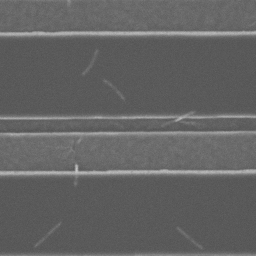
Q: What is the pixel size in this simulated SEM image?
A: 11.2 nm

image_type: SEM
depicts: lines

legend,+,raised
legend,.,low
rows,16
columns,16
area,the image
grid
................
................
++++++++++++++++
++++++++++++++++
++++++++++++++++
++++++++++++++++
++++++++++++++++
................
................
................
................
++++++++++++++++
++++++++++++++++
++++++++++++++++
++++++++++++++++
++++++++++++++++